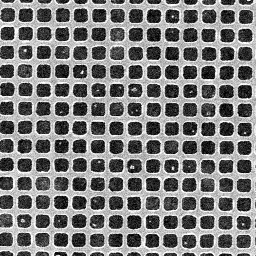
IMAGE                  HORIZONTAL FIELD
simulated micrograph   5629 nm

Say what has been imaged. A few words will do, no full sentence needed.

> a regular array of holes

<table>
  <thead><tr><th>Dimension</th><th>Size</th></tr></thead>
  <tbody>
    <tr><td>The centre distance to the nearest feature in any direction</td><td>0.398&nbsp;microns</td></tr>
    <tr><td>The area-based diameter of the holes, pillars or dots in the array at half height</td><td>352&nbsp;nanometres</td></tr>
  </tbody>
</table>